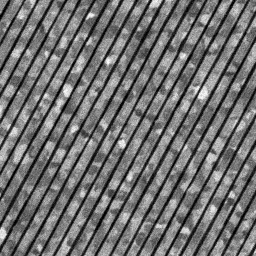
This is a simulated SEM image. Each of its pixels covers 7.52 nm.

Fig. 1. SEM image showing parallel lines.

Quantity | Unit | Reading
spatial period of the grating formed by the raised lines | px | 12.3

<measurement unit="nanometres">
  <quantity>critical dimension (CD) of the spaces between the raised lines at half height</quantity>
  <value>28.1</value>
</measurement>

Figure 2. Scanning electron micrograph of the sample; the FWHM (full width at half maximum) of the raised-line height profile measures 8.35 px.